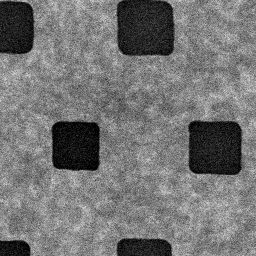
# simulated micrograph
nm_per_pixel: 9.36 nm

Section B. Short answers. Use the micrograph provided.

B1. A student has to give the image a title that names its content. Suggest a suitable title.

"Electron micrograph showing holes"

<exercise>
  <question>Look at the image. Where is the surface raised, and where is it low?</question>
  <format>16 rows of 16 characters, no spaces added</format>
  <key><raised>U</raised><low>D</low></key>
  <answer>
DDUUUUUDDDDUUUUU
DDUUUUUDDDDUUUUU
DDUUUUUDDDDUUUUU
UUUUUUUUUUUUUUUU
UUUUUUUUUUUUUUUU
UUUUUUUUUUUUUUUU
UUUUUUUUUUUUUUUU
UUUUUUUUUUUUUUUU
UUUDDDUUUUUUDDDU
UUUDDDUUUUUUDDDU
UUUUDDUUUUUUDDDU
UUUUUUUUUUUUUUUU
UUUUUUUUUUUUUUUU
UUUUUUUUUUUUUUUU
UUUUUUUUUUUUUUUU
DDUUUUUDDDDUUUUU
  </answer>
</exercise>